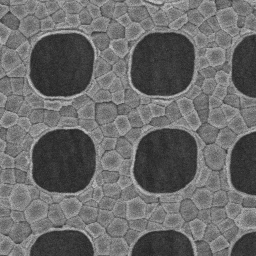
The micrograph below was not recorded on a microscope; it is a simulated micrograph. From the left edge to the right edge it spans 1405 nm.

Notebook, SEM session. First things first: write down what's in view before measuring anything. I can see holes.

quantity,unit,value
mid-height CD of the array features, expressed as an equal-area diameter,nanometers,371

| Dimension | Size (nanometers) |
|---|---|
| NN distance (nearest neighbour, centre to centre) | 531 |